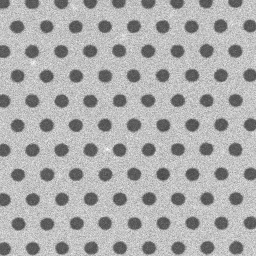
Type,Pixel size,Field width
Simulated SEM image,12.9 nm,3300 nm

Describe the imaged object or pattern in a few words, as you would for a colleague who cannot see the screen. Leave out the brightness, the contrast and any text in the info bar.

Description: a regular array of holes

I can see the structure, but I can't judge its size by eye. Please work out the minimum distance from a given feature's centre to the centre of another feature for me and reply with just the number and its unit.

364 nanometers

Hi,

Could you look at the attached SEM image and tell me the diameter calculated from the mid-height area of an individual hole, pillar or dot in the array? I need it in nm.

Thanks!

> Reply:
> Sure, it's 171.